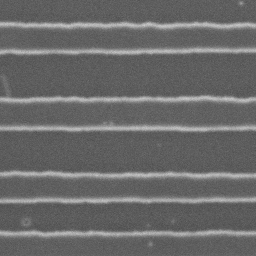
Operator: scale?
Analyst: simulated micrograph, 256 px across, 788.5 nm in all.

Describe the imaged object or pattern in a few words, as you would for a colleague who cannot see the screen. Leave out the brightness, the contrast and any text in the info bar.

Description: lines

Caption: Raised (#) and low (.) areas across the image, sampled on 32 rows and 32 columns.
................................
................................
................................
################################
################################
################################
#######################.........
................................
................................
................................
................................
................................
################################
################################
################################
################################
................................
................................
................................
................................
................................
................................
################################
################################
################################
................................
................................
................................
................................
################################
################################
################################